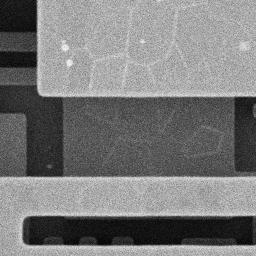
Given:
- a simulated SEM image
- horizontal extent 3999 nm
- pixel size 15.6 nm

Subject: wiring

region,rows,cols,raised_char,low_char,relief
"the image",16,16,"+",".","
..++++++++++++++
..++++++++++++++
..++++++++++++++
..++++++++++++++
..++++++++++++++
..++++++++++++++
................
................
................
................
................
++++++++++++++++
++++++++++++++++
++..............
+...............
++++++++++++++++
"